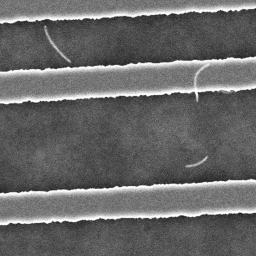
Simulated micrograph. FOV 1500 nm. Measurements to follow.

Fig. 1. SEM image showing lines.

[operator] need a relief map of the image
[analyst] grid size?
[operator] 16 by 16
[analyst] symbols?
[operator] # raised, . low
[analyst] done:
################
................
................
................
################
################
................
................
................
................
................
............####
################
###########.....
................
................